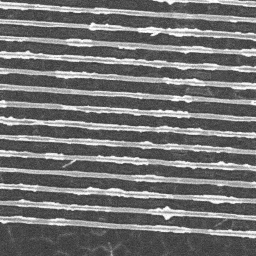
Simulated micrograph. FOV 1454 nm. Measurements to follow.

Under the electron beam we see parallel lines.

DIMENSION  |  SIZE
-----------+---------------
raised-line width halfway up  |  26.2 nanometres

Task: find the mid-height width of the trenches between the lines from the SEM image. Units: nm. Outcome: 63.1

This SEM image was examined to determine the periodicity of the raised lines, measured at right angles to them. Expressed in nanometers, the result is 93.3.